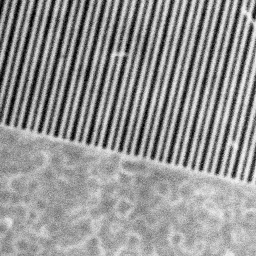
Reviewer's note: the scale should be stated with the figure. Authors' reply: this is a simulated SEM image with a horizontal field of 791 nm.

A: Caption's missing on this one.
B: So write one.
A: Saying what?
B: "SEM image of parallel lines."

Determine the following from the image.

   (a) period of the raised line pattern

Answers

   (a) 25.6 nm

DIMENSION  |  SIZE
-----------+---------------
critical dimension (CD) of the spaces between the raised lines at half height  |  14.7 nanometers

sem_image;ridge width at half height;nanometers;9